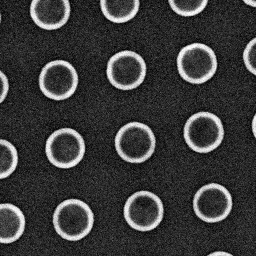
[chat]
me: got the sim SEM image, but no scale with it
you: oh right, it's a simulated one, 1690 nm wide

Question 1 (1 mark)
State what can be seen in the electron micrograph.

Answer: a regular array of raised bodies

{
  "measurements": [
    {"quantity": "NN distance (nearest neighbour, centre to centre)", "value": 455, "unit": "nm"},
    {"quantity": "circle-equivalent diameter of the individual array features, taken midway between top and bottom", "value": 242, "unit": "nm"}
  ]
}